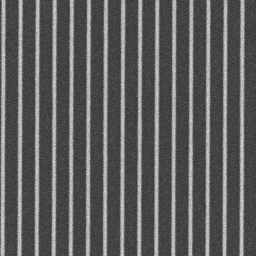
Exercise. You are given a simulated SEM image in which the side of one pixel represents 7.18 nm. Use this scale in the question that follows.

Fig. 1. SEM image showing parallel lines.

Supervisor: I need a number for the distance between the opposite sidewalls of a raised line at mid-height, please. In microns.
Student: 0.0269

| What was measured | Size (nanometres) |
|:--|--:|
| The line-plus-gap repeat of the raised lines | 122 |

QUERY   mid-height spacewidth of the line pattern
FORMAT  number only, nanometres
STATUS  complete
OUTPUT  95.1